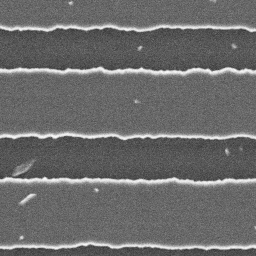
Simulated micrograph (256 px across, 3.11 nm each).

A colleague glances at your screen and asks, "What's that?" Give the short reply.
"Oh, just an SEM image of lines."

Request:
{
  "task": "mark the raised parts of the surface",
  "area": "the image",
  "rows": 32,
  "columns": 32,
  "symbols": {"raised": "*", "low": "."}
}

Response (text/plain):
********************************
********************************
********************************
*******.*****.******....*..*****
................................
................................
................................
................................
............*...................
********************************
********************************
********************************
********************************
********************************
********************************
********************************
********************************
................................
................................
................................
................................
................................
****************.*.****.....****
********************************
********************************
********************************
********************************
********************************
********************************
********************************
********************************
................................